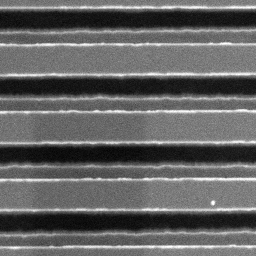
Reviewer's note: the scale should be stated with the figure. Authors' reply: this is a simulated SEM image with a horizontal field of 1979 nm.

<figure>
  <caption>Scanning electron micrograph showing lines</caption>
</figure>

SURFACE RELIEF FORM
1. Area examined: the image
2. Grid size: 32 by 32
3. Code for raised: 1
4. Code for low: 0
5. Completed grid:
11111111111111111111111111111111
00000000000000000000000000000000
00000000000000000000000000000000
00000000000000000000000000000000
11111111111111111111111111111111
11111111111111111111111111111111
11111111111111111111111111111111
11111111111111111111111111111111
11111111111111111111111111111111
00000000000000000000000000000000
00000000000000000000000000000000
00000000000000000000000000000000
11111111111111111111111111111111
11111111111111111111111111111111
11111111111111111111111111111111
11111111111111111111111111111111
11111111111111111111111111111111
11111111111111111111111111111111
00000000000000000000000000000000
00000000000000000000000000000000
00000000000000000000000000000000
11111111111111111111111111111111
11111111111111111111111111111111
11111111111111111111111111111111
11111111111111111111111111111111
11111111111111111111111111111111
00000000000000000000000000000000
00000000000000000000000000000000
00000000000000000000000000000000
11111111111111111111111111111111
11111111111111111111111111111111
11111111111111111111111111111111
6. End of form